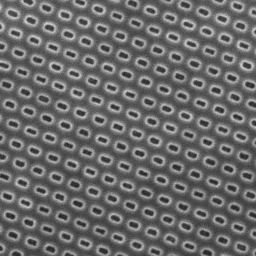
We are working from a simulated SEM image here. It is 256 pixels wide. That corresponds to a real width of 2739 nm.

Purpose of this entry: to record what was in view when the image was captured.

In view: a regular array of holes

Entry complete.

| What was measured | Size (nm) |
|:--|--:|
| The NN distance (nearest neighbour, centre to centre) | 208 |